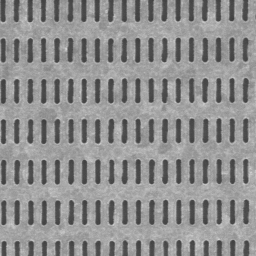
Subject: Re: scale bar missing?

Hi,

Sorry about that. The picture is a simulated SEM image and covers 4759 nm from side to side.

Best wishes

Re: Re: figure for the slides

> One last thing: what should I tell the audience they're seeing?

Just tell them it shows a regular array of holes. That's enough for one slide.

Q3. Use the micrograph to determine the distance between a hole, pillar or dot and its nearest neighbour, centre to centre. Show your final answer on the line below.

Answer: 249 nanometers